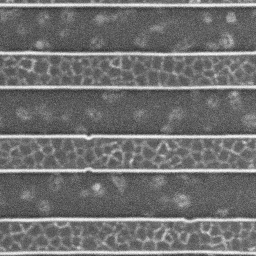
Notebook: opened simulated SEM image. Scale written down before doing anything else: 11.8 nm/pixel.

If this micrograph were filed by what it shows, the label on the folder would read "one or a few lines or trenches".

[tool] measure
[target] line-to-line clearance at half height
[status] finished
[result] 585 nm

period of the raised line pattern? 0.982 um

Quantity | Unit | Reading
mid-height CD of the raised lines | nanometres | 391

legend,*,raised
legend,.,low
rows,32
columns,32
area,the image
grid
********************************
................................
................................
................................
................................
................................
................................
********************************
********************************
********************************
********************************
................................
................................
................................
................................
................................
................................
********************************
********************************
********************************
********************************
................................
................................
................................
................................
................................
................................
.....***........***.............
********************************
********************************
********************************
**********...****..........*****